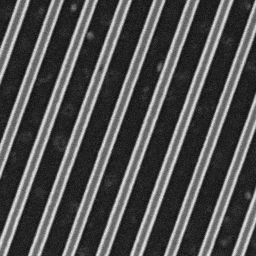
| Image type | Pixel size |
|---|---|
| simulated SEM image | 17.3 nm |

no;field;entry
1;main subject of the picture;parallel lines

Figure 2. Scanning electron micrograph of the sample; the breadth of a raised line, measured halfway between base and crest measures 0.147 microns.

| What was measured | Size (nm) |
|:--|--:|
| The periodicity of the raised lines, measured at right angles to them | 554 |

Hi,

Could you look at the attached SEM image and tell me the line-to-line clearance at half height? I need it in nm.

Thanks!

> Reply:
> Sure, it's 410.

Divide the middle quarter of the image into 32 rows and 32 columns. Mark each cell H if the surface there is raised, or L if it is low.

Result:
HHLLLLLLHHHLLLLLLHHLLLLLLHHHLLLL
HHLLLLLLHHLLLLLLHHHLLLLLLHHLLLLL
HLLLLLLLHHLLLLLLHHHLLLLLLHHLLLLL
HLLLLLLHHHLLLLLLHHLLLLLLHHLLLLLL
HLLLLLLHHLLLLLLHHHLLLLLLHHLLLLLL
LLLLLLLHHLLLLLLHHLLLLLLLHHLLLLLL
LLLLLLHHHLLLLLLHHLLLLLLHHLLLLLLL
LLLLLLHHLLLLLLHHLLLLLLLHHLLLLLLH
LLLLLLHHLLLLLLHHLLLLLLHHHLLLLLLH
LLLLLHHLLLLLLLHHLLLLLLHHLLLLLLLH
LLLLLHHLLLLLLHHLLLLLLLHHLLLLLLHH
LLLLLHHLLLLLLHHLLLLLLHHHLLLLLLHH
LLLLHHLLLLLLHHHLLLLLLHHLLLLLLLHH
LLLLHHLLLLLLHHHLLLLLLHHLLLLLLHHL
LLLHHHLLLLLLHHLLLLLLHHHLLLLLLHHL
LLLHHLLLLLLHHHLLLLLLHHLLLLLLHHHL
LLLHHLLLLLLHHLLLLLLLHHLLLLLLHHLL
LLHHHLLLLLLHHLLLLLLHHLLLLLLLHHLL
LLHHLLLLLLHHHLLLLLLHHLLLLLLHHHLL
LLHHLLLLLLHHLLLLLLLHHLLLLLLHHLLL
LHHHLLLLLLHHLLLLLLHHLLLLLLLHHLLL
LHHLLLLLLHHHLLLLLLHHLLLLLLHHHLLL
LHHLLLLLLHHLLLLLLHHHLLLLLLHHLLLL
HHLLLLLLLHHLLLLLLHHLLLLLLLHHLLLL
HHLLLLLLHHHLLLLLLHHLLLLLLHHHLLLL
HHLLLLLLHHLLLLLLHHHLLLLLLHHLLLLL
HLLLLLLLHHLLLLLLHHLLLLLLLHHLLLLL
HLLLLLLHHLLLLLLLHHLLLLLLHHLLLLLL
HLLLLLLHHLLLLLLHHHLLLLLLHHLLLLLL
LLLLLLHHHLLLLLLHHLLLLLLHHHLLLLLL
LLLLLLHHLLLLLLLHHLLLLLLHHLLLLLLL
LLLLLLHHLLLLLLHHLLLLLLLHHLLLLLLH